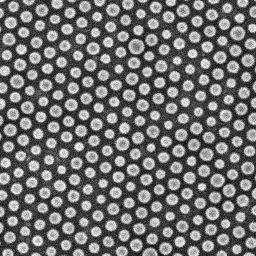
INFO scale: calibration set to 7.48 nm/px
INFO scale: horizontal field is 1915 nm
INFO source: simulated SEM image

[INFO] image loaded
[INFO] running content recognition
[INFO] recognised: a regular array of raised bodies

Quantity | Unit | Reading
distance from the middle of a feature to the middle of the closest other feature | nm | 118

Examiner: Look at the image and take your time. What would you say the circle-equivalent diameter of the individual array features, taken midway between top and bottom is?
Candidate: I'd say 0.075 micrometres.